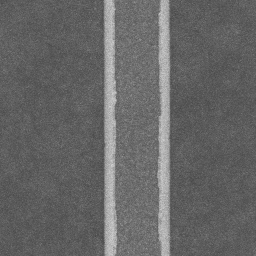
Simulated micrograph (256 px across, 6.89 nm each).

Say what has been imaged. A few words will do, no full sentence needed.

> one or a few lines or trenches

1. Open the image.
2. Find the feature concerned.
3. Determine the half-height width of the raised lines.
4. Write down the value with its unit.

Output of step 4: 55.8 pixels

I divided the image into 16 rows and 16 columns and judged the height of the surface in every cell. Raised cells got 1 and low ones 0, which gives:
0000000111000000
0000000111000000
0000000111000000
0000000111000000
0000000111000000
0000000111000000
0000000111000000
0000000111000000
0000000111000000
0000000111000000
0000000111000000
0000000111000000
0000000111000000
0000000111000000
0000000111000000
0000000111000000